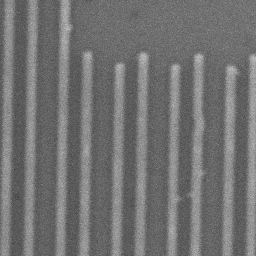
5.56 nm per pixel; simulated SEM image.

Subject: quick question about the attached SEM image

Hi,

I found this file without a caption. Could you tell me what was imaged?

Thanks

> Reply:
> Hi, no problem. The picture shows parallel lines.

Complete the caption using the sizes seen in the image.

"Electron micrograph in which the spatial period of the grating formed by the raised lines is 154 nm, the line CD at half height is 43.8 nm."